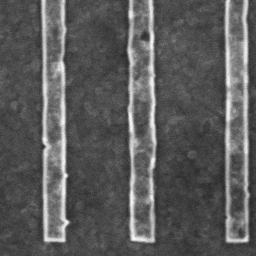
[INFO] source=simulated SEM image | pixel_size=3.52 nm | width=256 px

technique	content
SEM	one or a few lines or trenches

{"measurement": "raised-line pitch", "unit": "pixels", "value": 91.4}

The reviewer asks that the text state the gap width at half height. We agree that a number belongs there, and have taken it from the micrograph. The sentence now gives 248 nm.